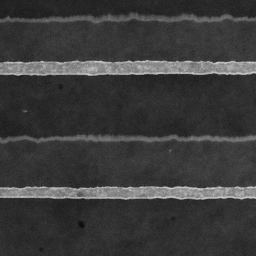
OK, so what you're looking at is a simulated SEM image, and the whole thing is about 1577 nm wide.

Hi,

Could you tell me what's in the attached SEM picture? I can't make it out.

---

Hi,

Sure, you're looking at lines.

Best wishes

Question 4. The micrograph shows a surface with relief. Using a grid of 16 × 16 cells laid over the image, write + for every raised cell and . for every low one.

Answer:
................
++++++++++++++++
++++++++++++++++
++++++++++++++++
++++++++++++++++
................
................
................
................
++++++++++++++++
++++++++++++++++
++++++++++++++++
................
................
................
................